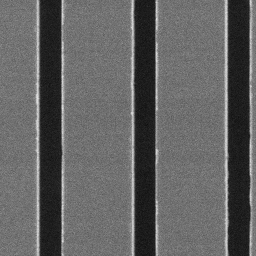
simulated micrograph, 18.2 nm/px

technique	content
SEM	lines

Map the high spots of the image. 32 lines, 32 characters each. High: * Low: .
*****...*********...********...*
*****...*********...********...*
*****...*********...********...*
*****...*********...********...*
*****...*********...********...*
*****...*********...********...*
*****...*********...********...*
*****...*********...********...*
*****...*********...********...*
*****...*********...********...*
*****...*********...********...*
*****...*********...********...*
*****...*********...********...*
*****...*********...********...*
*****...*********...********...*
*****...*********...********...*
*****...*********...********...*
*****...*********...********...*
*****...*********...********...*
*****...*********...********...*
*****...*********...********...*
*****...*********...********...*
*****...*********...********...*
*****...*********...********...*
*****...*********...********...*
*****...*********...********...*
*****...*********...********...*
*****...*********...********...*
*****...*********...********...*
*****...*********...********...*
*****...*********...********...*
*****...*********...********...*